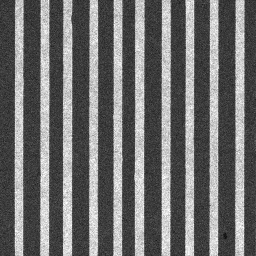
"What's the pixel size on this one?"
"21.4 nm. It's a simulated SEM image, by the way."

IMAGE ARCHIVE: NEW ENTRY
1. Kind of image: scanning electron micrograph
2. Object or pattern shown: parallel lines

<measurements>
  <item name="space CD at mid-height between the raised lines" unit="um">0.353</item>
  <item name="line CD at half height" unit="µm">0.166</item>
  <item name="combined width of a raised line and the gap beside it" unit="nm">525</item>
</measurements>